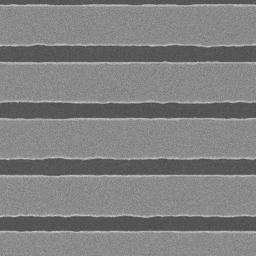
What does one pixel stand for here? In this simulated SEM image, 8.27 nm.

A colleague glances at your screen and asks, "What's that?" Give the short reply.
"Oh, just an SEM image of lines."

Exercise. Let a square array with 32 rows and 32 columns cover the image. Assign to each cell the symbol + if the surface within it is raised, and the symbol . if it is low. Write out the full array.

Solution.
................................
++++++++++++++++++++++++++++++++
++++++++++++++++++++++++++++++++
++++++++++++++++++++++++++++++++
++++++++++++++++++++++++++++++++
++++++++++++++++++++++++++++++++
................................
................................
++++++++++++++++++++++++++++++++
++++++++++++++++++++++++++++++++
++++++++++++++++++++++++++++++++
++++++++++++++++++++++++++++++++
++++++++++++++++++++++++++++++++
................................
................................
++++++++++++++++++++++++++++++++
++++++++++++++++++++++++++++++++
++++++++++++++++++++++++++++++++
++++++++++++++++++++++++++++++++
++++++++++++++++++++++++++++++++
................................
................................
++++++++++++++++++++++++++++++++
++++++++++++++++++++++++++++++++
++++++++++++++++++++++++++++++++
++++++++++++++++++++++++++++++++
++++++++++++++++++++++++++++++++
................................
................................
++++++++++++++++++++++++++++++++
++++++++++++++++++++++++++++++++
++++++++++++++++++++++++++++++++